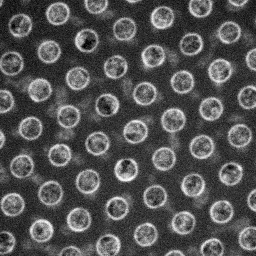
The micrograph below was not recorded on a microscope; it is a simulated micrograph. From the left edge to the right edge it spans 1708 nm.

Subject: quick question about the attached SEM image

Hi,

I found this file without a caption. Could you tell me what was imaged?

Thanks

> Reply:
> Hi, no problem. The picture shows a regular array of raised bodies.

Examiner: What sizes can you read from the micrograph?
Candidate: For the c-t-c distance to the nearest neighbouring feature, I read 260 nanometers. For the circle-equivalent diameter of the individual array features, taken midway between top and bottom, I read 0.14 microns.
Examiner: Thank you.